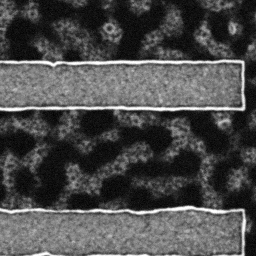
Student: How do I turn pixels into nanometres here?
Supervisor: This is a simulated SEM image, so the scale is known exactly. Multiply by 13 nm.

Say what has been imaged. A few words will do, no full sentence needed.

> one or a few lines or trenches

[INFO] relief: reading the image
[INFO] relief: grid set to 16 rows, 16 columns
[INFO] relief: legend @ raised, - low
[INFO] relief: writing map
@@@@@@@@@@@@@@@@
@@@@@@@@@@@@@@@@
@@@@@@@@@@@@@@@@
@@@@@@@@@@@@@@@@
---------------@
---------------@
---------------@
@@@@@@@@@@@@@@@@
@@@@@@@@@@@@@@@@
@@@@@@@@@@@@@@@@
@@@@@@@@@@@@@@@@
@@@@@@@@@@@@@@@@
@@@@@@@@@@@@@@@@
---------------@
---------------@
---------------@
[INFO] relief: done